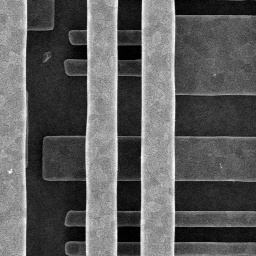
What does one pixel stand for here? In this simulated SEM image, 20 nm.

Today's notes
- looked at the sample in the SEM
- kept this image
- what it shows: wiring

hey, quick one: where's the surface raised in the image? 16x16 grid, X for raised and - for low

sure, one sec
XX---XX--XX-----
XX---XX--XX-----
XX---XX--XX-----
XX---XX--XX-----
XX---XX--XX-----
XX---XX--XX-----
XX---XX--XX-----
XX---XX--XX-----
XX---XX--XX-----
XX---XX--XX-----
XX---XX--XX-----
XX---XX--XX-----
XX---XX--XX-----
XX---XX--XX-----
XX---XX--XX-----
XX---XX--XX-----